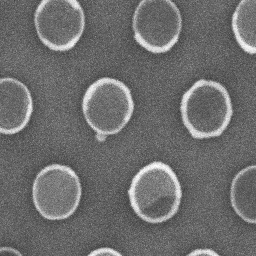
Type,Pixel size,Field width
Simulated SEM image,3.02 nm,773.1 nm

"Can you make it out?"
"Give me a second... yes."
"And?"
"raised bodies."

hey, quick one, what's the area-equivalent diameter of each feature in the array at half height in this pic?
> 161 nm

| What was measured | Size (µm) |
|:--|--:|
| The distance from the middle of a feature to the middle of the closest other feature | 0.296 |